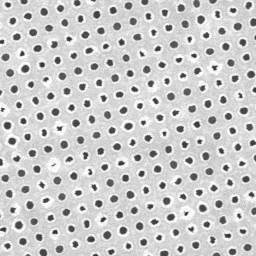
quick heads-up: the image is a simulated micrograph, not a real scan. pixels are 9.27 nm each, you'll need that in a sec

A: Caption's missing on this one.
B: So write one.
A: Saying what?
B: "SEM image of a regular array of holes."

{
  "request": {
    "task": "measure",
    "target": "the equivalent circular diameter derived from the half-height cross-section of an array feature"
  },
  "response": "0.0694 microns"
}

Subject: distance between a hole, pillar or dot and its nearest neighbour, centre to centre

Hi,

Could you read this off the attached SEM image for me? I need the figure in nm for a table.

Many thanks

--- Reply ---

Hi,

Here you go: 148